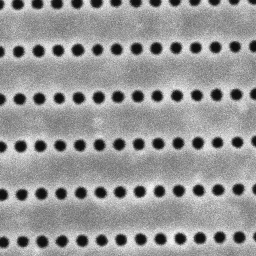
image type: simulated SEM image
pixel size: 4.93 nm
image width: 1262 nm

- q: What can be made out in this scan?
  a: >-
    a regular array of holes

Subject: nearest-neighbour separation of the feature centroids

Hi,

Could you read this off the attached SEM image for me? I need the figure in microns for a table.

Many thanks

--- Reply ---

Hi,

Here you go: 0.0964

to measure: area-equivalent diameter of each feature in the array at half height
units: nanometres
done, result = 61.4